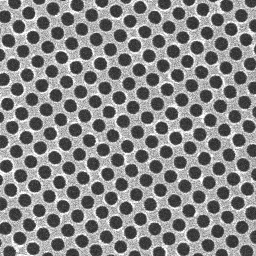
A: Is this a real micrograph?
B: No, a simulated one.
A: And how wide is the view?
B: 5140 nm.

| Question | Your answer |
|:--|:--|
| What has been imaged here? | a regular array of holes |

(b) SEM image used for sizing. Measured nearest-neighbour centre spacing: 343 nm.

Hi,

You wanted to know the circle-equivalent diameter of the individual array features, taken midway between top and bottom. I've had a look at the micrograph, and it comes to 275 nm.